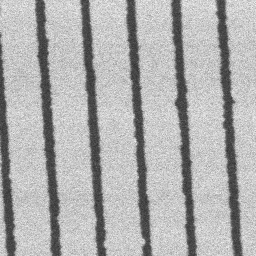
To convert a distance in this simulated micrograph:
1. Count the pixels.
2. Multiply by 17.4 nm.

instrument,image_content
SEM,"parallel lines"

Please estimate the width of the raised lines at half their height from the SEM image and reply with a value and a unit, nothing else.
10.1 pixels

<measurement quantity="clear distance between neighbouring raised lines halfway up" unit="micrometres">0.607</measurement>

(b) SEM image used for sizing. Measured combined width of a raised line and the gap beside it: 785 nm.